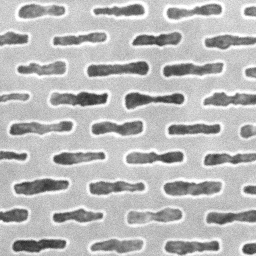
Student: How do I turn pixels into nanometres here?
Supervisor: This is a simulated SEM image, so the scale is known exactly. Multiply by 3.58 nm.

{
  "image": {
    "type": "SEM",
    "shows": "a regular array of holes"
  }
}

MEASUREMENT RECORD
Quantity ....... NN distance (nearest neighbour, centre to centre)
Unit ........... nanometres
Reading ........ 168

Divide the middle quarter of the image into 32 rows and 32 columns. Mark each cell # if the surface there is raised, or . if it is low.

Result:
.#####...............####.......
.####.................###.......
######...............####.......
################################
################################
################################
################################
...........#####.....######..###
...........####...............##
...........####...............##
##.#..#########.....############
################.###############
################################
################################
...#####....###.....############
...####.............######......
..#####.............######......
#######...###......#######......
################################
################################
################################
################################
..........######..............##
...........####...............##
.......########...............##
..##############################
################################
################################
################################
.######.........###.######......
.#####..............#####.......
######..............#####.......